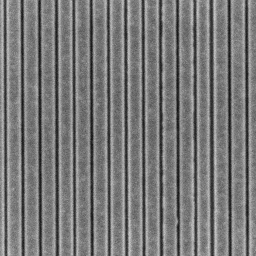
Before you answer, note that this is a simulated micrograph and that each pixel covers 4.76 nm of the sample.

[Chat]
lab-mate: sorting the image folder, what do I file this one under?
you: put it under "parallel lines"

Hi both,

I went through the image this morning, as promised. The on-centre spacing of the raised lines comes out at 0.082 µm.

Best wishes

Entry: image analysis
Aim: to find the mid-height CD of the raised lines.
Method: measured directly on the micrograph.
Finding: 63.6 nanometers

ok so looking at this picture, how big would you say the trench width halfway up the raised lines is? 17.2 nanometers